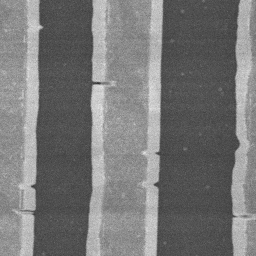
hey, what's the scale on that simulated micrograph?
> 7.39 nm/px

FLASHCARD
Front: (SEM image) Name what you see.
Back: one or a few lines or trenches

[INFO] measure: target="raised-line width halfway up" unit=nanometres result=422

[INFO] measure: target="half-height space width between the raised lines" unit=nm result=569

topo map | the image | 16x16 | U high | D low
UUDDDDUUUUDDDDDU
UUDDDDUUUUDDDDDU
UUDDDDUUUUDDDDDU
UUDDDDUUUUDDDDDU
UUDDDDUUUUDDDDDU
UUDDDDUUUUDDDDDU
UUDDDDUUUUDDDDDU
UUDDDDUUUUDDDDDU
UUDDDDUUUUDDDDDU
UUDDDDUUUUDDDDDU
UUDDDDUUUUDDDDDU
UUDDDDUUUUDDDDDU
UUDDDDUUUUDDDDDU
UUDDDDUUUUDDDDDU
UUDDDDUUUDDDDDDU
UUDDDDUUUDDDDDDU